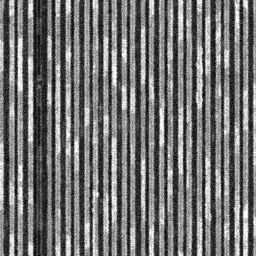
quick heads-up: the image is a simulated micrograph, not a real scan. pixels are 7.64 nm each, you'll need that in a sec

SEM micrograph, parallel lines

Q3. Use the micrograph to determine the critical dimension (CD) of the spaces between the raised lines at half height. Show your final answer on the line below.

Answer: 45.8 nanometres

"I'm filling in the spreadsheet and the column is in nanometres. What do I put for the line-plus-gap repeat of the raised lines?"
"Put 71.5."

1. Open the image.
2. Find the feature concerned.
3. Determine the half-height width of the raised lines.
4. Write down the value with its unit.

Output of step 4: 26.7 nm